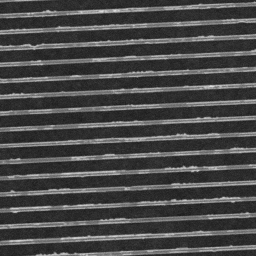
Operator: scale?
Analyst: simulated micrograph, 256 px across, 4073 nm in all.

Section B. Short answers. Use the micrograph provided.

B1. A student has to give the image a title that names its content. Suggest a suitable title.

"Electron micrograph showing parallel lines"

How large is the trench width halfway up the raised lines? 195 nm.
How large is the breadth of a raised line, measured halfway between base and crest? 55.6 nanometres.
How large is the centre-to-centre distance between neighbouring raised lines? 16.2 px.